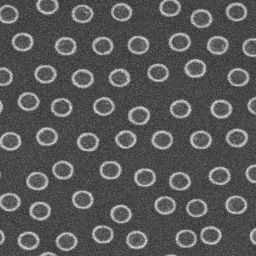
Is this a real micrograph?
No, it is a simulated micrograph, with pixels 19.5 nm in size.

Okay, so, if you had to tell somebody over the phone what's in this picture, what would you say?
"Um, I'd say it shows a regular array of raised bodies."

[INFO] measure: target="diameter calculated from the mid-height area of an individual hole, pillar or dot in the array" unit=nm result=349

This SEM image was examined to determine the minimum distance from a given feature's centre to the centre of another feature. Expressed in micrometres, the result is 0.639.